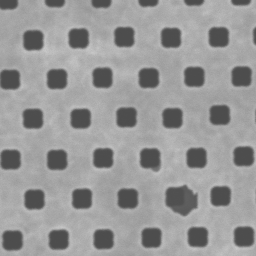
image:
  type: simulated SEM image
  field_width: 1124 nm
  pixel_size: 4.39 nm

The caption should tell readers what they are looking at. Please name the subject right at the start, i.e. a regular array of holes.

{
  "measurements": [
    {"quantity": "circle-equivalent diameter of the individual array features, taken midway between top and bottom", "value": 93.1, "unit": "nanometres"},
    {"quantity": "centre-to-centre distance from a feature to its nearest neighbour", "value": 200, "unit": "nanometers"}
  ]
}